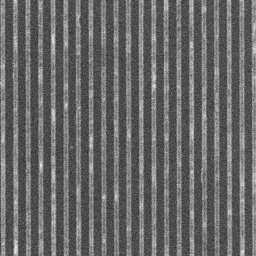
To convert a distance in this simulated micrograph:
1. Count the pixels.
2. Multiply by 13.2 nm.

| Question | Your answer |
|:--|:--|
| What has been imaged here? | parallel lines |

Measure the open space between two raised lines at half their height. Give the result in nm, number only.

120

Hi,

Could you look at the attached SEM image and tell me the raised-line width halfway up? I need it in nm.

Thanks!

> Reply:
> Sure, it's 49.7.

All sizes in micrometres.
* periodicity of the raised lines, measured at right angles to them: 0.167